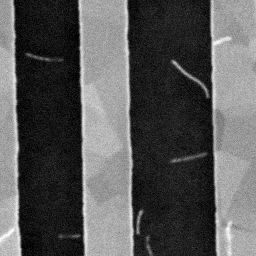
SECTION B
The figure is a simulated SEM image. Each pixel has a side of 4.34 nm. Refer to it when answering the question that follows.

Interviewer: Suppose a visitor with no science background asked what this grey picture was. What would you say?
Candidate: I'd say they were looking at lines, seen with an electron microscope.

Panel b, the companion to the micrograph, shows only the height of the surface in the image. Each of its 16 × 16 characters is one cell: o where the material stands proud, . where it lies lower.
o....ooo.....ooo
o....ooo.....ooo
o....ooo.....ooo
o....ooo.....ooo
o....ooo.....ooo
o....ooo.....ooo
o....ooo.....ooo
o....ooo.....ooo
o....ooo.....ooo
o....ooo.....ooo
o....ooo.....ooo
o....ooo.....ooo
o....ooo.....ooo
o....ooo.....ooo
o....ooo......oo
o....ooo......oo